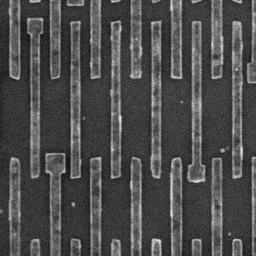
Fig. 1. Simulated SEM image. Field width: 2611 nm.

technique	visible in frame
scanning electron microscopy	wiring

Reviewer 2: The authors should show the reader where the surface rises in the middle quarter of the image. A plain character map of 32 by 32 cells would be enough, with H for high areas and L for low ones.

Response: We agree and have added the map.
LLHHLLLHHLLLHHLLLHHLLLHHLLLHHLLL
LLHHLLLHHLLLHHLLLHHLLLHHLLLHHLLL
LLHHLLLHHLLLHHLLLHHLLLHHLLLHHLLL
LLHHLLLHLLLLHHLLLLLLLLHHLLLLLLLL
LLHHLLLLLLLLHHLLLLLLLLHHLLLLLLLL
LLHHLLLLLLLLHHLLLLLLLLHHLLLLLLLL
LLHHLLLLLLLLHHLLLLLLLLHHLLLLLLLL
LLHHLLLLLLLLHHLLLLLLLLHHLLLLLLLL
LLHHLLLLLLLLHHLLLLLLLLHHLLLLLLLL
LLHHLLLLLLLLHHLLLLLLLLHHLLLLLLLL
LLHHLLLLLLLLHHLLLLLLLLHHLLLLLLLL
LLHHLLLLLLLLHHLLLLLLLLHHLLLLLLLL
LLHHLLLLLLLLHHLLLLLLLLHHLLLLLLLL
LLHHLLLLLLLLHHLLLLLLLLHHLLLLLLLL
LLHHLLLLLLLLHHLLLLLLLLHHLLLLLLLL
LLHHLLLLLLLLHHLLLLLLLLHHLLLLLLLL
LLHHLLLLLLLLHHLLLLLLLLHHLLLLLLLL
LLHHLLLLLLLLHHLLLLLLLLHHLLLLLLLL
LLHHLLLLLLLLHHLLLLLLLLHHLLLLLLLL
LLHHLLLLLLLLHHLLLLLLLLHHLLLLLLLL
LLHHLLLLLLLLHHLLLLLLLLHHLLLLLLLL
LLHHLLLLLLLLHHLLLLLLLLHHLLLLLLLL
LLHHLLLLLLLLHHLLLLLLLLHHLLLLLLLL
LLHHLLLLLLLLHHLLLLLLLLHHLLLLLLLL
LLHHLLLHHLLLHHLLLHHLLLHHLLLHHLLL
LLHHLLLHHLLLHHLLLHHLLLHHLLLHHLLH
LLHHLLLHHLLLHHLLLHHLLLHHLLLHHLLH
LLHHLLLHHLLLHHLLLHHLLLHHLLLHHLLH
LLLLLLLHHLLLLLLLLHHLLLLLLLLHHLLH
LLLLLLLHHLLLLLLLLHHLLLLLLLLHHLLL
LLLLLLLHHLLLLLLLLHHLLLLLLLLHHLLL
LLLLLLLHHLLLLLLLLHHLLLLLLLLHHLLL